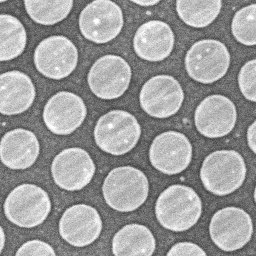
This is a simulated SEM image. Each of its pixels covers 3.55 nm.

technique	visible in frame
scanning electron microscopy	a regular array of raised bodies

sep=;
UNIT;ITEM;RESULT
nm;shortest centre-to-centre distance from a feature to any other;198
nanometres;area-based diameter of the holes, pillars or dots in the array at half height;149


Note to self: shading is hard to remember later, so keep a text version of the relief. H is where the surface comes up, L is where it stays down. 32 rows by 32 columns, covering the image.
LLLHHHHHHLLHHHLLLLHLLLHHHHHLLLLL
LLLHHHHHHLHHHHHLLLLLLLHHHHHLLLHH
HHLLHHHHLLHHHHHLLLLLLLLHHHHLLHHH
HHHLLLLLLLHHHHHLLLHHHLLLLLLLLHHH
HHHLLLLLLLLHHHLLLHHHHLLLLLLLLHHH
HHHLLHHHHLLLLLLLLHHHHHLLHHHHLLLH
HHHLHHHHHHLLLLLLLHHHHLLLHHHHLLLL
LLLLHHHHHHLLHHHLLLLLLLLHHHHHHLLL
LLLLLHHHHLLHHHHHLLLLLLLHHHHHLLHH
HHHLLLHHLLLHHHHHLLLLLLLLHHHHLLHH
HHHHLLLLLLLHHHHHLLHHHHLLLLLLLLHH
HHHHLLLLLLLLHHHLLLHHHHHLLLLLLLHH
HHHHLLHHHHLLLLLLLLHHHHHLLLHHHLLL
HHHLLLHHHHHLLLLLLLHHHHLLLHHHHLLL
LLLLLHHHHHHLLHHHLLLHHLLLHHHHHLLL
LLLLLLHHHHLLHHHHHLLLLLLLHHHHHLLL
LHHHLLLHLLLLHHHHHLLLLLLLLHHHHLLH
HHHHHLLLLLLLHHHHHLLHHHHLLLLLLLLH
HHHHHLLLLLLLLHHHLLLHHHHHLLLLLLLH
HHHHHLLHHHHLLLLLLLLHHHHHLLHHHHLL
LHHHLLLHHHHHLLLLLLLHHHHLLHHHHHLL
LLLLLLLHHHHHLLHHHHLLLHLLLHHHHHHL
LLLLLLLHHHHLLHHHHHLLLLLLLHHHHHLL
LLHHHLLLHHLLLHHHHHHLLHHLLLHHHLLL
LHHHHHLLLLLLLHHHHHLLHHHHHLLLLLLL
LHHHHHLLLLLLLLHHHHLLHHHHHLLLLLLL
LHHHHHLLHHHHLLLLLLLLHHHHHLLHHHHL
LHHHHLLLHHHHLLLLLLLLHHHHHLHHHHHL
LLLLLLLHHHHHHLLLHHLLLHHLLLHHHHHL
LLLLLLLLHHHHLLHHHHHLLLLLLLHHHHHL
LLLHHHLLLHHLLLHHHHHLLLHHLLLHHHHL
LLHHHHHLLLLLLLHHHHHLLHHHHLLLLLLL